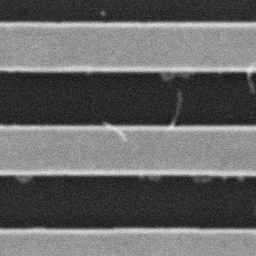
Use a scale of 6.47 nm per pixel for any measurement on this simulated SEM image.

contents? lines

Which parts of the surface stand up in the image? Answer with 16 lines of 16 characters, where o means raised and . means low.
................
oooooooooooooooo
oooooooooooooooo
oooooooooooooooo
...............o
................
................
................
oooooooooooooooo
oooooooooooooooo
oooooooooooooooo
................
................
................
oooooooooooooooo
oooooooooooooooo